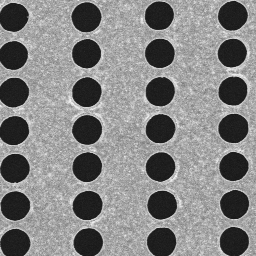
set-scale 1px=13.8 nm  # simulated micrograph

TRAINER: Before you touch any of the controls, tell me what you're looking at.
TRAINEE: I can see a regular array of holes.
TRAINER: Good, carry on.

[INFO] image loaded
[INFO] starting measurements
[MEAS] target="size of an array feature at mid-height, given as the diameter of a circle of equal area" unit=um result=0.406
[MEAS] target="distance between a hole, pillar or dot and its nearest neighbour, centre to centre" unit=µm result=0.516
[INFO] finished